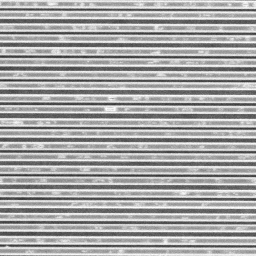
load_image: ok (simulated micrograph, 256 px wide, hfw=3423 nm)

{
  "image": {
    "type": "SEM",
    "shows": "parallel lines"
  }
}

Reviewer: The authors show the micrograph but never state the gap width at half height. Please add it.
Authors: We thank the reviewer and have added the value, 0.0535 micrometres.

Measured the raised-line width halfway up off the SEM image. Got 91.9 nm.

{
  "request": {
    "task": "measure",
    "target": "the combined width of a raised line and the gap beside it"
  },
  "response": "158 nanometers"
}